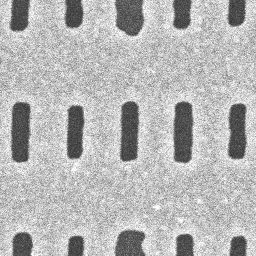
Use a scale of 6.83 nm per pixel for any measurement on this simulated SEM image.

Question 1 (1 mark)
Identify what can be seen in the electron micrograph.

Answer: holes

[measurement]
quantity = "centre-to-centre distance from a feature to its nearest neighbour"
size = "370 nm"